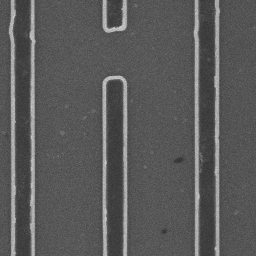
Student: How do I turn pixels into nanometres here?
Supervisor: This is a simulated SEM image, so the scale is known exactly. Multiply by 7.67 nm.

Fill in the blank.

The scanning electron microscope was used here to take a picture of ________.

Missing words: one or a few lines or trenches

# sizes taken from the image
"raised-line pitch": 707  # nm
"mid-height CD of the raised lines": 157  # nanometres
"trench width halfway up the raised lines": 548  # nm